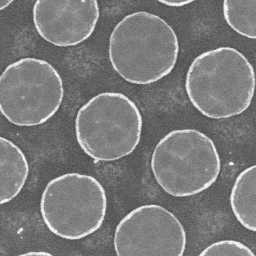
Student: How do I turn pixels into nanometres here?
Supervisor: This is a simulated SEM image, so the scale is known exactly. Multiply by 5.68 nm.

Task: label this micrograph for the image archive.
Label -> raised bodies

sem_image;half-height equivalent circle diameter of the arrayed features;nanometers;377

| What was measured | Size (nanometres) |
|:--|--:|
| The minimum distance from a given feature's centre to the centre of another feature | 483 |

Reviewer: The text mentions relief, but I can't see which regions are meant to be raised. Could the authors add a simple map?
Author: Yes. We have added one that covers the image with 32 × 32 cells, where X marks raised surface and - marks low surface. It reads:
X---XXXXXXXX---------XX-----XXXX
----XXXXXXXX----------------XXXX
----XXXXXXXX---XXXXX--------XXXX
-----XXXXXXX--XXXXXXX--------XXX
-----XXXXXX---XXXXXXXX---------X
-------XX-----XXXXXXXX----------
--------------XXXXXXXX----XXXX--
---XX---------XXXXXXXX--XXXXXXX-
-XXXXXX-------XXXXXXX---XXXXXXX-
XXXXXXX--------XXXXX---XXXXXXXXX
XXXXXXXX---------------XXXXXXXXX
XXXXXXXX---------------XXXXXXXXX
XXXXXXXX---XXXXX--------XXXXXXX-
XXXXXXX---XXXXXXX--------XXXXXX-
-XXXXX----XXXXXXX---------XXX---
--XXX-----XXXXXXXX--------------
----------XXXXXXX-----XXX-------
X---------XXXXXXX---XXXXXX------
XX--------XXXXXXX---XXXXXXX-----
XXX--------XXXX----XXXXXXXX-----
XXX----------------XXXXXXXX-----
XXX----------------XXXXXXXX----X
XXX----XXXXX--------XXXXXXX---XX
XXX---XXXXXXX-------XXXXXX---XXX
XX---XXXXXXXX---------X------XXX
-----XXXXXXXX----------------XXX
-----XXXXXXXX----XXXX--------XXX
------XXXXXXX--XXXXXXX--------XX
------XXXXXX---XXXXXXXX--------X
--------XX----XXXXXXXXX---------
--------------XXXXXXXXX----XXX--
---------------XXXXXXXX--XXXXXX-